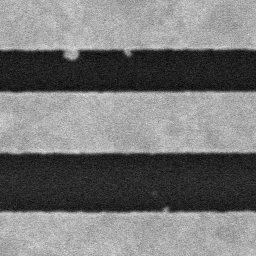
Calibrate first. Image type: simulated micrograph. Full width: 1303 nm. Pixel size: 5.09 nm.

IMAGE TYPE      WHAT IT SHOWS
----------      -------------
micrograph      lines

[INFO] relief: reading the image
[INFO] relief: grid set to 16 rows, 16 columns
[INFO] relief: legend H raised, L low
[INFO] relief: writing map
HHHHHHHHHHHHHHHH
HHHHHHHHHHHHHHHH
HHHHHHHHHHHHHHHH
LLLLLLLLLLLLLLLL
LLLLLLLLLLLLLLLL
LLLLLLLLLLLLLLLL
HHHHHHHHHHHHHHHH
HHHHHHHHHHHHHHHH
HHHHHHHHHHHHHHHH
HHHHHHHHHHHHHHHH
LLLLLLLLLLLLLLLL
LLLLLLLLLLLLLLLL
LLLLLLLLLLLLLLLL
HHHHHHHHHHHHHHHH
HHHHHHHHHHHHHHHH
HHHHHHHHHHHHHHHH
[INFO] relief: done